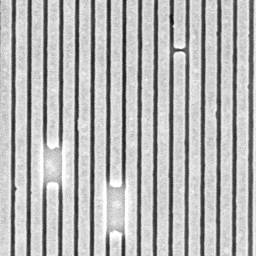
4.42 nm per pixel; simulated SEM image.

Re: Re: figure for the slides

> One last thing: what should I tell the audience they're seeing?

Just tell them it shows parallel lines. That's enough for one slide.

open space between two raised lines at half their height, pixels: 4.89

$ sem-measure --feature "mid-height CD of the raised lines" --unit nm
48.1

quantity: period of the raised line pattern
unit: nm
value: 69.9